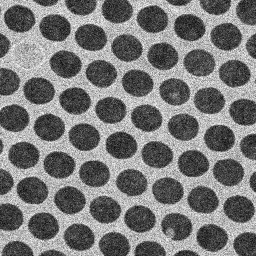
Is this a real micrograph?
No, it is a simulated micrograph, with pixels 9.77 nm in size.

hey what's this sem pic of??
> a regular array of holes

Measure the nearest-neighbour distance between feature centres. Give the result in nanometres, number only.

356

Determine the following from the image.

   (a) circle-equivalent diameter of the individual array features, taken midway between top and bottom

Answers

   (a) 292 nm